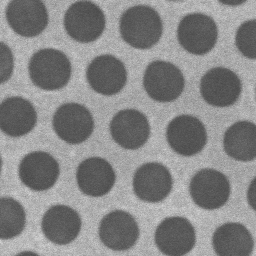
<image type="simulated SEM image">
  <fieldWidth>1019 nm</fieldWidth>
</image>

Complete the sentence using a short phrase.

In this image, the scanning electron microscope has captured a regular array of holes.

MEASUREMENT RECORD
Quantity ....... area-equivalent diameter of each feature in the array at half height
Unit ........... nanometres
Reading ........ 162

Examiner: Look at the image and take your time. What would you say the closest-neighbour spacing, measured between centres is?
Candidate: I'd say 227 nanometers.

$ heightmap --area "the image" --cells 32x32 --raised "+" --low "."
+....++++...++++++++++++++++..++
+.....++.....+++....++++++++++++
+.....++.....++.....+++....+++++
+.....++.....++.....++.....+++..
+++.+++++...+++.....++.....++...
.+++++++++++++++...++++....++...
.++++...+++++++++++++++...++++..
..++.....+++...+++++++++++++++++
..++.....++.....++....+++++.++++
.+++.....++.....++.....++.....++
++++....+++.....++.....++.....++
++++++++++++...+++.....++.....++
+..++++++++++++++++...++++....++
....+++....+++++++++++++++++++++
.....++....+++....++++..++++++++
....+++.....++.....++....++++...
....+++....+++.....++.....++....
++++++++...+++....+++.....++....
+++++++++++++++..++++....+++....
+++...+++++++++++++++++.+++++...
++.....+++....++++..++++++++++++
++.....+++....+++....++++...++++
+++....+++....+++.....++....++++
++++..++++....+++....+++.....++.
+++++++++++.+++++....+++.....++.
..+++++++++++++++++++++++...+++.
...+++...+++++..++++++++++++++++
...++.....+++....++++..+++++++++
...++.....++.....+++....+++....+
..++++....++.....++.....+++....+
+++++++.+++++....++.....+++.....
+++.++++++++++++++++....+++....+